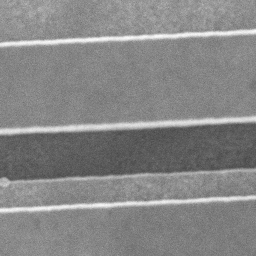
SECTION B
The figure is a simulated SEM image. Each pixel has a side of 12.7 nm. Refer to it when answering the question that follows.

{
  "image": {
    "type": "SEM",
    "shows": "lines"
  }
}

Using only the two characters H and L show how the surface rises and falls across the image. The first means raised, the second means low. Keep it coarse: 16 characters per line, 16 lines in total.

HHHHHHHHHHHHHHHH
HHHHHHHHHHHHHHHH
HHHHHHHHHHHHHHHH
HHHHHHHHHHHHHHHH
HHHHHHHHHHHHHHHH
HHHHHHHHHHHHHHHH
HHHHHHHHHHHHHHHH
HHHHHHHHHHHHHHHH
LLLLLLLLLLLLLLLL
LLLLLLLLLLLLLLLL
LLLLLLLLLLLLLLLL
HHHHHHHHHHHHHHHH
HHHHHHHHHHHHHHHH
HHHHHHHHHHHHHHHH
HHHHHHHHHHHHHHHH
HHHHHHHHHHHHHHHH